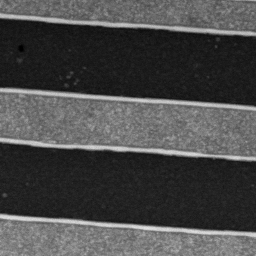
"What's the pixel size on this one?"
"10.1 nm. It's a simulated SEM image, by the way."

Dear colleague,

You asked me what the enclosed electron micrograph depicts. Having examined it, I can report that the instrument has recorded one or a few lines or trenches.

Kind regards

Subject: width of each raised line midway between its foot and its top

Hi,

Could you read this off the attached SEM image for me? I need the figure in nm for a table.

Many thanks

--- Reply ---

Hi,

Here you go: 518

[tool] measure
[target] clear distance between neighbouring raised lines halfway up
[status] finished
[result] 747 nanometres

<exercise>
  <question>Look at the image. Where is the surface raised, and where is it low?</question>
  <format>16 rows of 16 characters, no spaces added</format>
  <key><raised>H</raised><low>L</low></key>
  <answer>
HHHHHHHHHHHHHHHH
LLLLLLHHHHHHHHHH
LLLLLLLLLLLLLLLL
LLLLLLLLLLLLLLLL
LLLLLLLLLLLLLLLL
LLLLLLLLLLLLLLLL
HHHHHHHHHHHHLLLL
HHHHHHHHHHHHHHHH
HHHHHHHHHHHHHHHH
LLLLLLLLLLHHHHHH
LLLLLLLLLLLLLLLL
LLLLLLLLLLLLLLLL
LLLLLLLLLLLLLLLL
LLLLLLLLLLLLLLLL
HHHHHHHHHHHHHLLL
HHHHHHHHHHHHHHHH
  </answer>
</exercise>